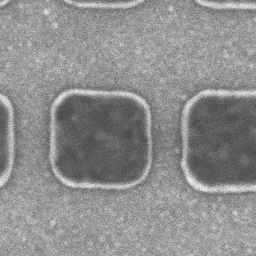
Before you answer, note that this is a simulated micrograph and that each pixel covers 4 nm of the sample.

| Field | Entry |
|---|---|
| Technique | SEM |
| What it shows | raised bodies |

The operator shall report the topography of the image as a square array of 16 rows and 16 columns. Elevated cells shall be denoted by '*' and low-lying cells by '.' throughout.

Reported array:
................
................
................
................
................
................
...******...****
*..******...****
*..******...****
*..******...****
*..******...****
....****....****
................
................
................
................